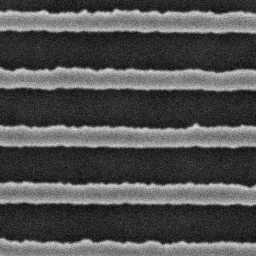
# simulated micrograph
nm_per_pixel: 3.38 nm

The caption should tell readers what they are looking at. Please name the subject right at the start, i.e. lines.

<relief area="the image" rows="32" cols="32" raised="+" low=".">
................................
++...+....+.+.++++++.+..+.......
++++++++++++++++++++++++++++++++
++++++++++++++++++++++++++++++++
................................
................................
................................
................................
.......+........................
++++++++++++++++++++++++++++++++
++++++++++++++++++++++++++++++++
................................
................................
................................
................................
................................
++++++++++++++++++++++++++++++++
++++++++++++++++++++++++++++++++
................................
................................
................................
................................
................................
++++++++++++++++++++++++++++++++
++++++++++++++++++++++++++++++++
.........................+.++.++
................................
................................
................................
................................
++++++++++++++++++++++++++++++++
++++++++++++++++++++++++++++++++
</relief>